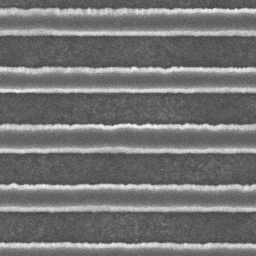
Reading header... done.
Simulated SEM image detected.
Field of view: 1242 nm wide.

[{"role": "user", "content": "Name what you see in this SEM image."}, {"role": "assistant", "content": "lines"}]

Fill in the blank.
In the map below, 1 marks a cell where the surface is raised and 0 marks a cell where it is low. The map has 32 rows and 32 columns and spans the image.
00000000000000000000000000000000
11111111111111111111111111111111
11111111111111111111111111111111
11111111111111111111111111111111
00000000000000000000000000000000
00000000000000000000000000000000
00000000000000000000000000000000
00000000000000000000000000000000
00000000000000000000001000000000
11111111111111111111111111111111
11111111111111111111111111111111
00000000000000000000000000000000
00000000000000000000000000000000
00000000000000000000000000000000
00000000000000000000000000000000
00000000000000000000000000000000
11111111111111111111111111111111
11111111111111111111111111111111
11111111111111111111111111111111
00000000000000000000000000000000
00000000000000000000000000000000
00000000000000000000000000000000
00000000000000000000000000000000
11111111111111111111111111111111
11111111111111111111111111111111
11111111111111111111111111111111
00000000000000000000000000000000
00000000000000000000000000000000
00000000000000000000000000000000
00000000000000000000000000000000
10001011100000100011000000000000
11111111111111111111111111111111